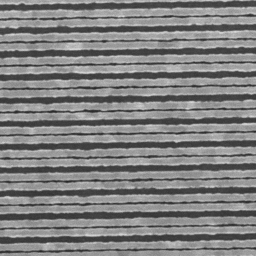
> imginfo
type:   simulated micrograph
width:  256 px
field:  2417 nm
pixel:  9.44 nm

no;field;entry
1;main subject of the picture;parallel lines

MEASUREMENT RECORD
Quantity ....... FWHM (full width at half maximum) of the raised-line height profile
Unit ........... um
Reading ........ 0.0602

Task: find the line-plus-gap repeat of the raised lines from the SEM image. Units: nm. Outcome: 110